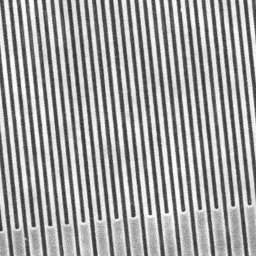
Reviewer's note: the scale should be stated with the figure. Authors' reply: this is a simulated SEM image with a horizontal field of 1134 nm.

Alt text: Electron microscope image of parallel lines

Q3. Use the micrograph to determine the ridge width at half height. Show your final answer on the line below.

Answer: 3.59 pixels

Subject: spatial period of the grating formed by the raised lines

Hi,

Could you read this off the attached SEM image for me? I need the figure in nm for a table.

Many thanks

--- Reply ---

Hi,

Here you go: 36.9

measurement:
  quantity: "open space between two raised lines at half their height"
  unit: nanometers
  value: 19.8